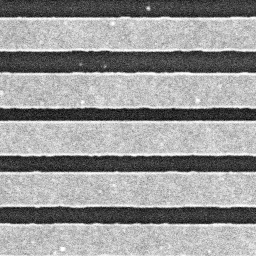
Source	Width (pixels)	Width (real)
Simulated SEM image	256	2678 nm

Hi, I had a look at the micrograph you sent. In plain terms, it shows lines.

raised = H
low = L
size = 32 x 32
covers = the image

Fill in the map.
LLLLLLLLLLLLLLLLLLLLLLLLLLLLLLLL
LLLLLLLLLLLLLLLLLLLLLLLLLLLLLLLL
HHHHHHHHHHHHHHHHHHHHHHHHHHHHHHHH
HHHHHHHHHHHHHHHHHHHHHHHHHHHHHHHH
HHHHHHHHHHHHHHHHHHHHHHHHHHHHHHHH
HHHHHHHHHHHHHHHHHHHHHHHHHHHHHHHH
LLLLLLLLLLLLLLLLLLLLLLLLLLLLLLLL
LLLLLLLLLLLLLLLLLLLLLLLLLLLLLLLL
LLLLLLLLLLLLLLLLLLLLLLLLLLLLLLLL
HHHHHHHHHHHHHHHHHHHHHHHHHHHHHHHH
HHHHHHHHHHHHHHHHHHHHHHHHHHHHHHHH
HHHHHHHHHHHHHHHHHHHHHHHHHHHHHHHH
HHHHHHHHHHHHHHHHHHHHHHHHHHHHHHHH
LLLLLLLLLLLLLLLLLLLLLLLLLLLLLLLL
LLLLLLLLLLLLLLLLLLLLLLLLLLLLLLLL
HHHHHHHHHHHHHHHHHHHHHHHHHHHHHHHH
HHHHHHHHHHHHHHHHHHHHHHHHHHHHHHHH
HHHHHHHHHHHHHHHHHHHHHHHHHHHHHHHH
HHHHHHHHHHHHHHHHHHHHHHHHHHHHHHHH
LLLLLLLLLLLLLLLLLLLLLLLLLLLLLLLL
LLLLLLLLLLLLLLLLLLLLLLLLLLLLLLLL
LLLLLLLLLLLLLLLLLLLLLLLLLLLLLLLL
HHHHHHHHHHHHHHHHHHHHHHHHHHHHHHHH
HHHHHHHHHHHHHHHHHHHHHHHHHHHHHHHH
HHHHHHHHHHHHHHHHHHHHHHHHHHHHHHHH
HHHHHHHHHHHHHHHHHHHHHHHHHHHHHHHH
LLLLLLLLLLLLLLLLLLLLLLLLLLLLLLLL
LLLLLLLLLLLLLLLLLLLLLLLLLLLLLLLL
HHHHHHHHHHHHHHHHHHHHHHHHHHHHHHHH
HHHHHHHHHHHHHHHHHHHHHHHHHHHHHHHH
HHHHHHHHHHHHHHHHHHHHHHHHHHHHHHHH
HHHHHHHHHHHHHHHHHHHHHHHHHHHHHHHH